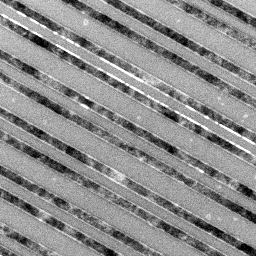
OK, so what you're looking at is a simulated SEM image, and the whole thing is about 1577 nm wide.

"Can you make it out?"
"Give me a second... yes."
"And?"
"parallel lines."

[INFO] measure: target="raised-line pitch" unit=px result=25.1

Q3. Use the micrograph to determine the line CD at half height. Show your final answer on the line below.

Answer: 60.5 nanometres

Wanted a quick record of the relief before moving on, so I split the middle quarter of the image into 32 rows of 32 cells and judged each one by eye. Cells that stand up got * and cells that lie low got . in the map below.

...****......*****..........****
.....****......*****..........**
......*****.....*****...........
........*****.....***.*.........
..........****......*****.......
*...........****......*****.....
**............****......*****...
****...........*****.....*****..
.*****...........*****.....*****
...*****...........****......**.
......****...........****......*
*......****............****.....
***.....*****...........*****...
*****......****...........*****.
..*****.....*****...........****
....*****.....*****...........**
.....*****......****............
.......*****.....*****..........
.........*****......****........
...........*****.....*****......
**...........*****.....*****....
***...........*****......****...
.****...........*****......****.
...****...........*****......***
....*****...........*****.....**
......*****...........****......
**......****...........*****....
****......****...........*****..
.*****.....*****...........*****
...*****.....*****...........***
.....****......****............*
......*****......****...........